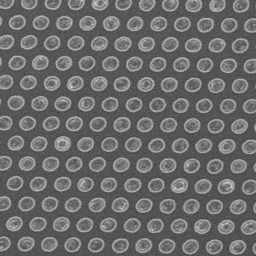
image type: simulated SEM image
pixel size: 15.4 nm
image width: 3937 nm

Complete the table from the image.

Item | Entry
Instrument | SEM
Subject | a regular array of raised bodies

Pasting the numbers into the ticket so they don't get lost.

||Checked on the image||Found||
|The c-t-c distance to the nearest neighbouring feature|354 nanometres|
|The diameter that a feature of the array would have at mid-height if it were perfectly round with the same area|224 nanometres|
